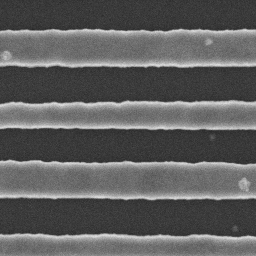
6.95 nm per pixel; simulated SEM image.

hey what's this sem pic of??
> lines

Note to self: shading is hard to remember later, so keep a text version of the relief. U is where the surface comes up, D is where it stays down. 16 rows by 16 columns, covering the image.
DDDDDDDDDDDDDDDD
DDDDDDDDDDDDDDDD
UUUUUUUUUUUUUUUU
UUUUUUUUUUUUUUUU
DDDDDDDDDDDDDDDD
DDDDDDDDDDDDDDDD
UUDUUUUUUUUUUUUU
UUUUUUUUUUUUUUUU
DDDDDDDDDDDDDDDD
DDDDDDDDDDDDDDDD
UUUUUUUUUUUUUUUU
UUUUUUUUUUUUUUUU
DDDDDDDDDDDDDDDD
DDDDDDDDDDDDDDDD
DDDDDDDDDDDDDDDD
UUUUUUUUUUUUUUUU